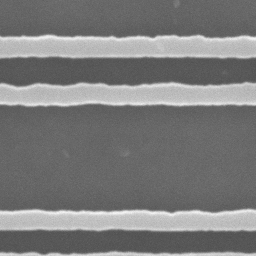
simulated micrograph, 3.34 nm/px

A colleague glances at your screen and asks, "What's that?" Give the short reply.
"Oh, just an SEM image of lines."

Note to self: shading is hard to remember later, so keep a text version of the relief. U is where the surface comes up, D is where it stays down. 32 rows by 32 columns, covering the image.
DDDDDDDDDDDDDDDDDDDDDDDDDDDDDDDD
DDDDDDDDDDDDDDDDDDDDDDDDDDDDDDDD
DDDDDDDDDDDDDDDDDDDDDDDDDDDDDDDD
DDDDDDDDDDDDDDDDDDDDDDDDDDDDDDDD
DDDDDDUDDDDDDDDDDDDDDDDDUDDDDDDD
UUUUUUUUUUUUUUUUUUUUUUUUUUUUUUUU
UUUUUUUUUUUUUUUUUUUUUUUUUUUUUUUU
DDDDDDDDDDDDDDDDDDDDDDDDDDDDDDDD
DDDDDDDDDDDDDDDDDDDDDDDDDDDDDDDD
DDDDDDDDDDDDDDDDDDDDDDDDDDDDDDDD
DDDDDDDDDDUDDDDDDDDDDUDDDDDDDDUU
UUUUUUUUUUUUUUUUUUUUUUUUUUUUUUUU
UUUUUUUUUUUUUUUUUUUUUUUUUUUUUUUU
DDDDDDDDDDDDDDDDDDDDDDDDDDDDDDDD
DDDDDDDDDDDDDDDDDDDDDDDDDDDDDDDD
DDDDDDDDDDDDDDDDDDDDDDDDDDDDDDDD
DDDDDDDDDDDDDDDDDDDDDDDDDDDDDDDD
DDDDDDDDDDDDDDDDDDDDDDDDDDDDDDDD
DDDDDDDDDDDDDDDDDDDDDDDDDDDDDDDD
DDDDDDDDDDDDDDDDDDDDDDDDDDDDDDDD
DDDDDDDDDDDDDDDDDDDDDDDDDDDDDDDD
DDDDDDDDDDDDDDDDDDDDDDDDDDDDDDDD
DDDDDDDDDDDDDDDDDDDDDDDDDDDDDDDD
DDDDDDDDDDDDDDDDDDDDDDDDDDDDDDDD
DDDDDDDDDDDDDDDDDDDDDDDDDDDDDDDD
DDDDDDDDDDDDDDDDDDDDDDDDDDDDDDDD
UUUUUUDUUDUUUDUUUUUUDDUUUUDDUUUU
UUUUUUUUUUUUUUUUUUUUUUUUUUUUUUUU
UUUUUUUUUUUUUUUUUUUUUUUUUUUUUUUU
DDDDDDDDDDDDDDDDDDDDDDDDDDDDDDDD
DDDDDDDDDDDDDDDDDDDDDDDDDDDDDDDD
DDDDDDDDDDDDDDUDDDDDDDDDDDDDDDDD